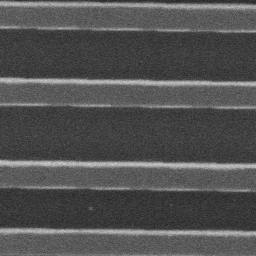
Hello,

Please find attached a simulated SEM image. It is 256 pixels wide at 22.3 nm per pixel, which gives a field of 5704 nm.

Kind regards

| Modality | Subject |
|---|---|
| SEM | lines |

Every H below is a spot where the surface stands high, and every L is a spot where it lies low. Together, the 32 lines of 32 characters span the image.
HHHHHHHHHHHHHHHHLLLLLLLLLLLLLLLL
HHHHHHHHHHHHHHHHHHHHHHHHHHHHHHHH
HHHHHHHHHHHHHHHHHHHHHHHHHHHHHHHH
LLLLLLHHHHHHHHHHHHHHHHHHHHHHHHHH
LLLLLLLLLLLLLLLLLLLLLLLLLLLLLLLL
LLLLLLLLLLLLLLLLLLLLLLLLLLLLLLLL
LLLLLLLLLLLLLLLLLLLLLLLLLLLLLLLL
LLLLLLLLLLLLLLLLLLLLLLLLLLLLLLLL
LLLLLLLLLLLLLLLLLLLLLLLLLLLLLLLL
LLLLLLLLLLLLLLLLLLLLLLLLLLLLLLLL
HHHHHHHHHHHHHHHHHHHHHHHHHHHHHHHH
HHHHHHHHHHHHHHHHHHHHHHHHHHHHHHHH
HHHHHHHHHHHHHHHHHHHHHHHHHHHHHHHH
LLLLLLLLLLLLLLLLLLLLLLLLLLLLLLLL
LLLLLLLLLLLLLLLLLLLLLLLLLLLLLLLL
LLLLLLLLLLLLLLLLLLLLLLLLLLLLLLLL
LLLLLLLLLLLLLLLLLLLLLLLLLLLLLLLL
LLLLLLLLLLLLLLLLLLLLLLLLLLLLLLLL
LLLLLLLLLLLLLLLLLLLLLLLLLLLLLLLL
LLLLLLLLLLLLLLLLLLLLLLLLLLLLLLLL
HHHHHHHHHHHHHHHHHHHHHHLLLLLLLLLL
HHHHHHHHHHHHHHHHHHHHHHHHHHHHHHHH
HHHHHHHHHHHHHHHHHHHHHHHHHHHHHHHH
LLLLLLLLLLLHHHHHHHHHHHHHHHHHHHHH
LLLLLLLLLLLLLLLLLLLLLLLLLLLLLLLL
LLLLLLLLLLLLLLLLLLLLLLLLLLLLLLLL
LLLLLLLLLLLLLLLLLLLLLLLLLLLLLLLL
LLLLLLLLLLLLLLLLLLLLLLLLLLLLLLLL
LLLLLLLLLLLLLLLLLLLLLLLLLLLLLLLL
HHHHHHHHHHHHHHHHHHHHHHHHHHHHHHHH
HHHHHHHHHHHHHHHHHHHHHHHHHHHHHHHH
HHHHHHHHHHHHHHHHHHHHHHHHHHHHHHHH